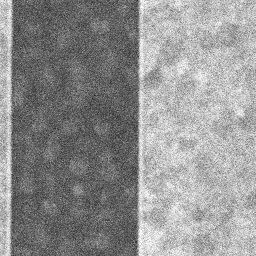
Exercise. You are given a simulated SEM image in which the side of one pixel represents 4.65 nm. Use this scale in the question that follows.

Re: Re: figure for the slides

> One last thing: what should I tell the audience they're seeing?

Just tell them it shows one or a few lines or trenches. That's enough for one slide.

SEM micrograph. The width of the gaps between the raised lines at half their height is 612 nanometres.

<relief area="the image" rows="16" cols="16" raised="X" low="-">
X--------XXXXXXX
X--------XXXXXXX
X--------XXXXXXX
X--------XXXXXXX
X--------XXXXXXX
X--------XXXXXXX
X--------XXXXXXX
X--------XXXXXXX
X--------XXXXXXX
X--------XXXXXXX
X--------XXXXXXX
X--------XXXXXXX
X--------XXXXXXX
---------XXXXXXX
---------XXXXXXX
X--------XXXXXXX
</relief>